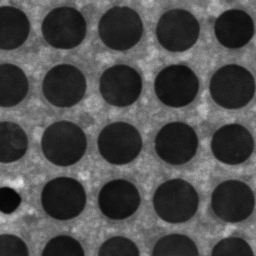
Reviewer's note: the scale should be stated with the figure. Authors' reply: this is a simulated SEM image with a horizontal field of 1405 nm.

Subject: a regular array of holes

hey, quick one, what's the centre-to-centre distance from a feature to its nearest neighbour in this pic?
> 0.306 µm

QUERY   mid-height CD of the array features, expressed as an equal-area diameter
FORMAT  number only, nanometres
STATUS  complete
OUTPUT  245